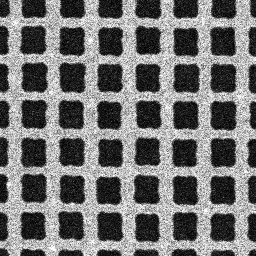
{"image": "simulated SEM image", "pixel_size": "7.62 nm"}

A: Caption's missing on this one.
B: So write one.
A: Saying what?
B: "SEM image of a regular array of holes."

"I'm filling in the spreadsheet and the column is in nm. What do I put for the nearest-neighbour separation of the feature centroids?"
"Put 280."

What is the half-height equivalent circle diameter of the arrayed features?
226 nm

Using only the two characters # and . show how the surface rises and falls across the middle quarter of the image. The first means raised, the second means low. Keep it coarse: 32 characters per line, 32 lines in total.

.....####.....####......####....
......##.......###......###.....
.....###.......###......###.....
.....###......####......###.....
.....###.......###......###.....
.....###.......###......###.....
.....####.....####......####....
################################
################################
....#####..#.#####......####....
.....###......####......###.....
.....###......####......###.....
.....###......####......###.....
.....###......####......###.....
.....###......####......###.....
.....###......####......###.....
###.############################
################################
.##.##############.....#########
.....####......###......###.....
.....###.......###......###.....
.....####......###......###.....
.....####......###......###.....
.....####......###......###.....
.....####......###......###.....
.....####.....#####.##.#####....
################################
################################
.....####.....####.....####.....
.....###......###.......###.....
.....###......####......###.....
.....###......####......###.....